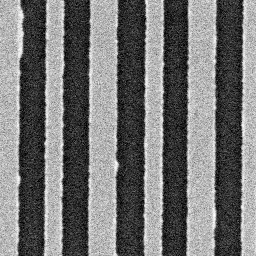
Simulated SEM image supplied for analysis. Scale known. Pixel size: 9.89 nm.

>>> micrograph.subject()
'lines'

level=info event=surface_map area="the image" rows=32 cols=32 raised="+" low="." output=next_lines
++....++...++++...++....+++...++
+++...++...++++...++....+++....+
+++...++...++++...++....+++...++
+++...++...++++...++....+++...++
+++...++...+++....++....+++...++
+++...++...++++...++....+++...++
+++...++...++++...++....+++...++
++....++...++++...++....+++...++
++....++...+++....++....+++...++
++....++...++++...++....+++...++
++....++...+++....++....+++...++
++....++...+++....++....+++...++
++....++...+++....++....+++...++
++....++...+++....++....+++...++
++....++...+++....++....+++...++
++....++...+++....++....+++...++
++....++...+++....++....+++...++
++....++...+++....++...++++...++
++....++...+++....++....+++...++
++....++...+++....++....+++...++
++....++...+++....++....+++...++
++....++...+++....++....+++...++
++....++...+++....++...++++...++
++....++...+++....++...++++...++
++....++...+++....++...++++...++
++....++...+++....++...++++...++
++....++...+++....++....+++...++
++....++...+++....++...++++...++
++....++...+++....++...++++...++
++....++...+++....++...++++...++
++....++...+++....++...++++...++
++....++...+++....++...++++...++